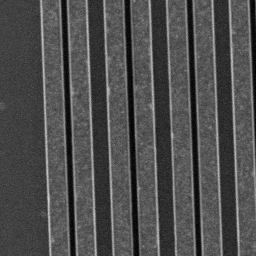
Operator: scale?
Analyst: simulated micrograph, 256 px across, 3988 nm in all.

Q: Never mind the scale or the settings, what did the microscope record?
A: parallel lines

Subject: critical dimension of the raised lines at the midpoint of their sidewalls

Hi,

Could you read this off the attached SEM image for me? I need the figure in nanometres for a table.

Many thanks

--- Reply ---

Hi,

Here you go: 298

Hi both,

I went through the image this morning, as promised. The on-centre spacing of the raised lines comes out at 31.1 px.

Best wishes